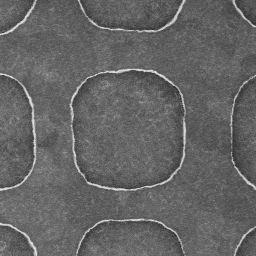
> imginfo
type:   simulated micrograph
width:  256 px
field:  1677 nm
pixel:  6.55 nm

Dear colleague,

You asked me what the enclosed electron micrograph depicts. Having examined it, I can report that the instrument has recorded holes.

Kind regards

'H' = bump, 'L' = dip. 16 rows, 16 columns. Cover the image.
LLHHHLLLLLLHHHHL
LHHHHHLLLLLHHHHH
HHHHHHHHHHHHHHHH
HHHHHHHHHHHHHHHH
HHHHHHHLLHHHHHHH
LHHHHLLLLLLHHHHL
LLHHLLLLLLLHHHHL
LLHHLLLLLLLLHHHL
LLHHHLLLLLLLHHHL
LLHHHLLLLLLLHHHL
LLHHHLLLLLLHHHHL
LHHHHHLLLLHHHHHH
HHHHHHHHHHHHHHHH
HHHHHHHHHHHHHHHH
LHHHHLLLLLLHHHHH
LLHHHLLLLLLHHHHL